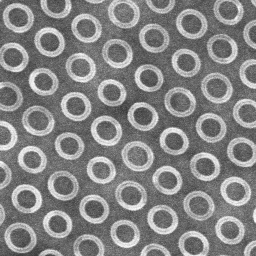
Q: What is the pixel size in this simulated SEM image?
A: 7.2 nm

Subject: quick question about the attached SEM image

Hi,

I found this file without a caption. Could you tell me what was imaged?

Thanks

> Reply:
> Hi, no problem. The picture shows a regular array of ring-shaped raised bodies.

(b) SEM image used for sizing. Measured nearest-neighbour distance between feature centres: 285 nanometers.